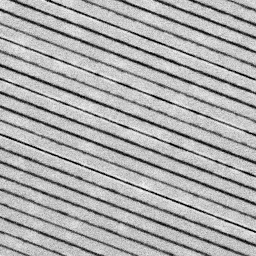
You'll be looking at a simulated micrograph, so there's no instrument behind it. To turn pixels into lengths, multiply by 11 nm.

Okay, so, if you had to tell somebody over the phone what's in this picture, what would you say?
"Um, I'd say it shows parallel lines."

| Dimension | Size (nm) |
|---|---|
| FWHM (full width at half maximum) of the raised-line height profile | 114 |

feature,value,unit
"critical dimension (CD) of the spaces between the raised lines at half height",30.8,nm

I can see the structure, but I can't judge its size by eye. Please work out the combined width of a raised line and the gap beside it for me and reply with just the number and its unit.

142 nanometers